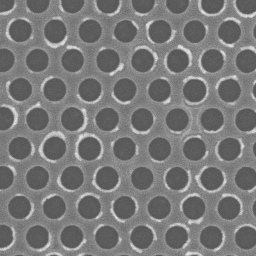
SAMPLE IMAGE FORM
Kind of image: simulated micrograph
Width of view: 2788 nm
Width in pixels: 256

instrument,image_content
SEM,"a regular array of holes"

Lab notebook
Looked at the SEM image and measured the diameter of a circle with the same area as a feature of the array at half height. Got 23.3 px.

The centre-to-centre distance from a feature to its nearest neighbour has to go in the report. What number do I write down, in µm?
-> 0.369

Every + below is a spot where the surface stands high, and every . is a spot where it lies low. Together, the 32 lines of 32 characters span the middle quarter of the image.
.....+++......+++.....++++.....+
....+++++....+++++...+++++....++
++++++++++++++++++++++++++++++++
++++++.++++++++.++++++++++++++++
++++.....++++....+++++....+++++.
++++.....++++.....+++......+++..
.++......+++......+++......+++..
++++.....+++......+++......+++..
++++....+++++....+++++....++++..
++++++.++++++++++++++++.++++++++
++++++++++++++++++++++++++++++++
....+++++....+++++...++++++...++
.....+++......+++.....++++.....+
.....+++......+++.....+++......+
.....+++......+++.....+++......+
....++++.....++++.....++++.....+
+..++++++...++++++...++++++...++
++++++++++++++++++++++++++++++++
+++++...++++++..+++++++..+++++++
++++.....++++....+++++....++++..
.++......+++......+++......+++..
.++......+++......+++......+++..
++++.....+++......+++......+++..
+++++...+++++....+++++....+++++.
++++++++++++++++++++++++++++++++
+..+++++++.++++++++.++++++++++++
....+++++....+++++....++++....++
.....+++......+++.....++++.....+
.....+++......+++.....+++......+
.....+++......+++.....+++......+
....+++++....++++.....++++....++
+.+++++++++++++++++.++++++++++++